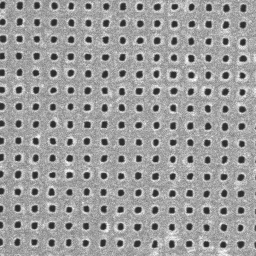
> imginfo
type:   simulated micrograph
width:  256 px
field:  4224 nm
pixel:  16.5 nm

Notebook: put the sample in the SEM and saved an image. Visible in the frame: a regular array of holes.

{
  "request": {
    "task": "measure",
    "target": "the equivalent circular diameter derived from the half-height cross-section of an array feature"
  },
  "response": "116 nanometres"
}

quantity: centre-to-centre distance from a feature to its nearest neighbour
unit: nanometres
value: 275